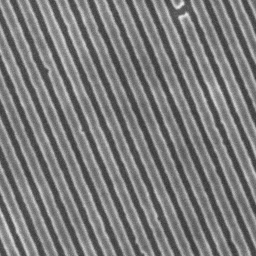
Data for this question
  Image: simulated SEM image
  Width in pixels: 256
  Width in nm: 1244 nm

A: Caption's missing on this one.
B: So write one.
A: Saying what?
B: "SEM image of parallel lines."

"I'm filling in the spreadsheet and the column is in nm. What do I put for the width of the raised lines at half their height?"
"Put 52.1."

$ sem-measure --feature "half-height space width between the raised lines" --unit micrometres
0.0353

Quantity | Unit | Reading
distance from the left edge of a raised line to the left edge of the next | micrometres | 0.0865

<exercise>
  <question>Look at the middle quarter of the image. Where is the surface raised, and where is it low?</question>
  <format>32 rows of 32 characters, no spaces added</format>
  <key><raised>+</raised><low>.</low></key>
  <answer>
+++..+++..++...++..+++..+++..+++
+++..+++..+++..+++..++..+++..+++
.+++..++..+++..+++..+++..+++..++
.+++..+++..+++..++..+++..+++..++
..++...++..+++..+++..+++..+++..+
..+++..+++..++...++...++..+++..+
..+++..+++..+++..+++..+++..++..+
+..+++..+++..++..+++..+++..+++..
+..+++..+++..+++..+++..++..+++..
++..+++..++..+++..+++..+++..+++.
++..+++..+++..+++..+++..++..+++.
++...++..+++..+++..+++..+++..++.
+++..+++..+++..+++.+++..+++..+++
.++...++..+++..+++..+++..++...++
.+++..+++..++...++..+++..+++..++
..++..+++..+++..+++..+++.+++..++
..++...++...++..+++..+++..+++..+
..+++..+++..+++..+++..++...++..+
+..++..+++..+++..+++..+++..+++..
+..+++..+++..++...++..+++..+++..
++..++..+++..+++..+++..+++..++..
++..+++..+++..++..+++..+++..+++.
++..+++..+++..+++..++...++..+++.
+++..++...++..+++..+++..+++..+++
+++..+++..+++..+++..+++..++..+++
.+++..++...++..+++..+++..+++..++
.+++..+++..+++..+++..++..+++..++
..++...++..+++..+++..+++..++..++
..+++..+++..++..+++..+++..+++..+
..+++..+++..+++..+++..+++..++..+
+..+++..++...++..+++..+++..+++..
+..+++..+++..+++..+++..++..+++..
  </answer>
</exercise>